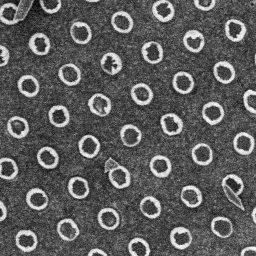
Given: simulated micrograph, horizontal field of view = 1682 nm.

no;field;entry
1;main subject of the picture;a regular array of raised bodies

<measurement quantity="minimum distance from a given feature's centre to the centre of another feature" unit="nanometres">278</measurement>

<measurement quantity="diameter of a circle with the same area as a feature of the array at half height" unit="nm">136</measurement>